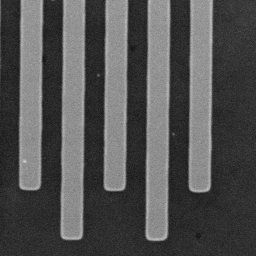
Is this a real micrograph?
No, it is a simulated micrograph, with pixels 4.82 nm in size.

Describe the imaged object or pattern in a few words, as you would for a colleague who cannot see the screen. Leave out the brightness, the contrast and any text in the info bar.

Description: groups of lines, slits or small figures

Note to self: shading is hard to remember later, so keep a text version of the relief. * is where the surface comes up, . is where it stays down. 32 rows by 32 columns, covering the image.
...**...***..***...**...**......
...**...***..***...**...**......
...**...***..***...**...**......
...**...***..***...**...**......
...**...***..***...**...**......
...**...***..***...**...**......
...**...***..***...**...**......
...**...**...***...**...**......
...**...**...***...**...**......
...**...**...***...**...**......
...**...**...***...**...**......
...**...**...***...**...**......
...**...**...***...**...**......
...**...**...***..***...**......
...**...**...***..***...**......
...**...**...***..***...**......
...**...**...***..***...**......
...**...**...***..***...**......
...**...**...***..***...**......
...**...**...***..***...**......
...**...**...***..***...**......
...**...**...***..***...**......
...**...**...***..***...**......
...**...**...**...***...**......
........**........***...........
........**........***...........
........**........***...........
........**........***...........
........**........***...........
........**........***...........
................................
................................